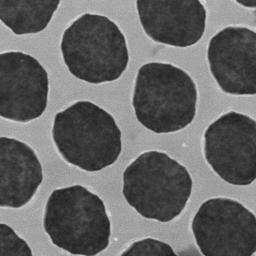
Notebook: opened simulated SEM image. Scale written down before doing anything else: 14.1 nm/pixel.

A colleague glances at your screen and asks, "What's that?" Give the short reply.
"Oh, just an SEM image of holes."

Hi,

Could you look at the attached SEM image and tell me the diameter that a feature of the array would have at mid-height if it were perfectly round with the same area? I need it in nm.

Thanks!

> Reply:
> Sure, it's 958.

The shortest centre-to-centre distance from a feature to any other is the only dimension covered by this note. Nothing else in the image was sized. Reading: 1.2 microns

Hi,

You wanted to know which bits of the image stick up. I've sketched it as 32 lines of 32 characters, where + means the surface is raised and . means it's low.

.......++++++++++........+++++..
.......++++++++++.........++++++
......++++....+++.........++++++
+.....++.......+++........++...+
++++++++.......++++......++.....
++++++++........+++++...++......
+.++++++........++++++++++......
.....+++........++++++++++......
.....++++.......++....++++......
......+++......++.......+++.....
......+++++++++++.......+++.....
......+++++++++++........+++....
......+++++++++++........+++++++
......++.....++++.......++++++++
.....++.......+++.......++++...+
+++++++........+++......++......
+++++++........++++..+++++......
..+++++........+++++++++++......
....+++........+++++++++++......
.....+++.......++....+++++......
.....++++.....++......++++......
.....+++++++++++.......++++.....
.....++++++++++.........++++....
.....+++...++++.........++++++++
....++......++++........++++++++
...+++.......+++.......++.....++
++++++.......++++......++......+
+++++.........++++++.+++........
.+++++........++++++++++........
..++++........++++++++++........
...++++......++++....++++.......
....+++++...++++......+++.......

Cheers